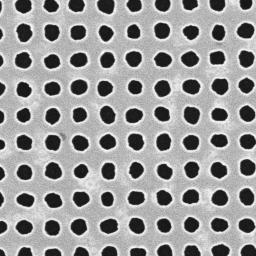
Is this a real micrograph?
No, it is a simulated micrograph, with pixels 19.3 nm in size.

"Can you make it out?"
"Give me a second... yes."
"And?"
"a regular array of holes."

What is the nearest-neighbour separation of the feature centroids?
0.521 µm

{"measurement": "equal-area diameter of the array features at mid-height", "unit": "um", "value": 0.31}